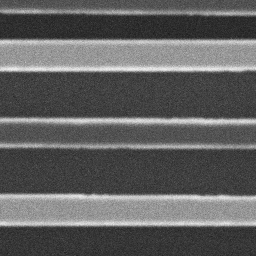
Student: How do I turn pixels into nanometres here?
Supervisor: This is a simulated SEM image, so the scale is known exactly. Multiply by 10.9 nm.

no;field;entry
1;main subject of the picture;lines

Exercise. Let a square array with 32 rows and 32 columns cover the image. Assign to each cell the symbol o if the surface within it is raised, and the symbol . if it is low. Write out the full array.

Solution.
oooooooooooooooooooooooooooooooo
oooooooooooooooooooooooooooooooo
................................
................................
................................
oooooooooooooooooooooooooooooooo
oooooooooooooooooooooooooooooooo
oooooooooooooooooooooooooooooooo
oooooooooooooooooooooooooooooooo
................................
................................
................................
................................
................................
................................
oooooooooooooooooooooooooooooooo
oooooooooooooooooooooooooooooooo
oooooooooooooooooooooooooooooooo
................................
................................
................................
................................
................................
................................
oooooooooooo....................
oooooooooooooooooooooooooooooooo
oooooooooooooooooooooooooooooooo
oooooooooooooooooooooooooooooooo
................................
................................
................................
................................